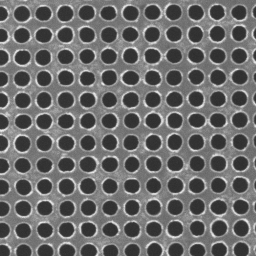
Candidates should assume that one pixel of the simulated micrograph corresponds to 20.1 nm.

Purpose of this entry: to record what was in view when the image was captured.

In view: a regular array of holes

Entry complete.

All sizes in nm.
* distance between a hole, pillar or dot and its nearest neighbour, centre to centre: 429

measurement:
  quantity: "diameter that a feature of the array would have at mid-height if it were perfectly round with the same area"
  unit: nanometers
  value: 314